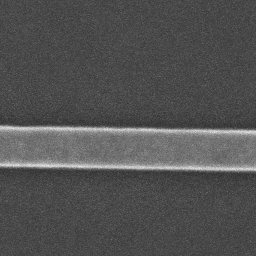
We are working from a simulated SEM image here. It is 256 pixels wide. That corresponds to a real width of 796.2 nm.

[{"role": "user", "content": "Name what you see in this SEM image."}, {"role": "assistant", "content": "one or a few lines or trenches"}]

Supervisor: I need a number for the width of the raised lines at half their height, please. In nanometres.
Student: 120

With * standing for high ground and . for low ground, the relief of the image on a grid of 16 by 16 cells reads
................
................
................
................
................
................
................
................
****************
****************
.........*******
................
................
................
................
................